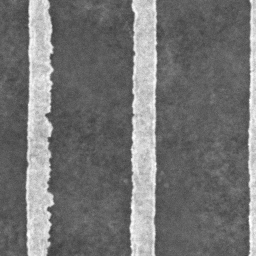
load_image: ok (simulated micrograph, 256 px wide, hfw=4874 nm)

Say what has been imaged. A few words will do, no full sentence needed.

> one or a few lines or trenches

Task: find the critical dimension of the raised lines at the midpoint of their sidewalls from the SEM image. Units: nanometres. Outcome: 383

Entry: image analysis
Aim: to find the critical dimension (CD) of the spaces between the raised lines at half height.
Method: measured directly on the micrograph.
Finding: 1760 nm